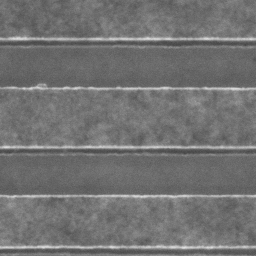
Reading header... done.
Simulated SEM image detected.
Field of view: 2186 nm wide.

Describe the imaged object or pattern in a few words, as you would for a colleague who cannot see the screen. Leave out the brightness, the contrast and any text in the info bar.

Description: lines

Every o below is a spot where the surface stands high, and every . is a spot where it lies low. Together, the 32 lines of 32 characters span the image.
oooooooooooooooooooooooooooooooo
oooooooooooooooooooooooooooooooo
oooooooooooooooooooooooooooooooo
oooooooooooooooooooooooooooooooo
oooooooooooooooooooooooooooooooo
................................
................................
................................
................................
................................
................................
oooooooooooooooooooooooooooooooo
oooooooooooooooooooooooooooooooo
oooooooooooooooooooooooooooooooo
oooooooooooooooooooooooooooooooo
oooooooooooooooooooooooooooooooo
oooooooooooooooooooooooooooooooo
oooooooooooooooooooooooooooooooo
................................
................................
................................
................................
................................
................................
oooooooooooooooooooooooooooooooo
oooooooooooooooooooooooooooooooo
oooooooooooooooooooooooooooooooo
oooooooooooooooooooooooooooooooo
oooooooooooooooooooooooooooooooo
oooooooooooooooooooooooooooooooo
oooooooooooooooooooooooooooooooo
................................